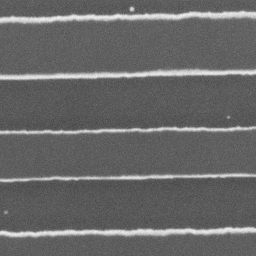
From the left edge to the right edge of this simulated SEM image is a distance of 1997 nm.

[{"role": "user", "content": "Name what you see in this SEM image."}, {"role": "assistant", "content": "lines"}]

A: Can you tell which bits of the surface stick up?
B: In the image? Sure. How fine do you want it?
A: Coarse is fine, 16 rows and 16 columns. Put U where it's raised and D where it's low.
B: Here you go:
DDDDDDDDDDDDDDDD
UUUUUUUUUUUUUUUU
UUUUUUUUUUUUUUUU
UUUUUUUUUUUUUUUU
UUUUUUUUUUUUUUUU
DDDDDDDDDDDDDDDD
DDDDDDDDDDDDDDDD
DDDDDDDDDDDDDDDD
UUUUUUUUUUUUUUUU
UUUUUUUUUUUUUUUU
UUUUUUUUUUUUUUUU
DDDDDDDDDDDDDDDD
DDDDDDDDDDDDDDDD
DDDDDDDDDDDDDDDD
DDDDUUUUUUUUUUUU
UUUUUUUUUUUUUUUU